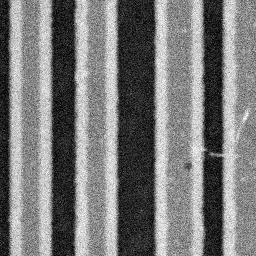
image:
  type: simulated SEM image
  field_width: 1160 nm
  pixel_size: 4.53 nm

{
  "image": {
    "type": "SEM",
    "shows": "one or a few lines or trenches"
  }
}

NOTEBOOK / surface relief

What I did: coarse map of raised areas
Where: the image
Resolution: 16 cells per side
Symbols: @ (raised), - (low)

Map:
-@@--@@---@@--@@
-@@--@@---@@--@@
-@@--@@---@@--@@
-@@--@@---@@--@@
-@@--@@---@@--@@
-@@--@@---@@--@@
-@@--@@---@@--@@
-@@--@@---@@--@@
-@@--@@---@@--@@
-@@--@@---@@--@@
-@@--@@---@@--@@
-@@--@@---@@--@@
-@@--@@---@@--@@
-@@--@@---@@--@@
-@@--@@---@@--@@
-@@--@@---@@--@@